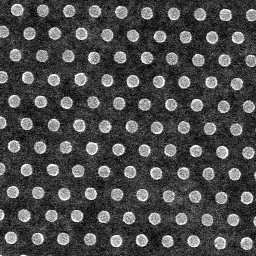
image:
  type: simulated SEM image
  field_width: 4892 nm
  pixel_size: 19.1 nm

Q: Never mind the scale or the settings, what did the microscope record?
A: a regular array of raised bodies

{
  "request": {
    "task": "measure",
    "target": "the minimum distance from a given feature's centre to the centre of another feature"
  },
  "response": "0.487 micrometres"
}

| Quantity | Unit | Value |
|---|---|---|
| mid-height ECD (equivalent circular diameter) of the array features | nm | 220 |